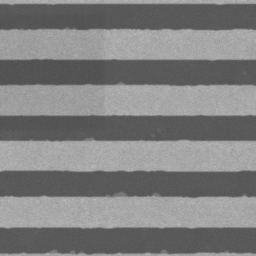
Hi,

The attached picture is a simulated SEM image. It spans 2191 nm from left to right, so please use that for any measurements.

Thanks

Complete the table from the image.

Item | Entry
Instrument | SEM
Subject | lines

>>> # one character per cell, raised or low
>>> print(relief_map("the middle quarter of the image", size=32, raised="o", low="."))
................................
................................
................................
................................
................................
oooooooooooooooooooooooooooo..o.
oooooooooooooooooooooooooooooooo
oooooooooooooooooooooooooooooooo
oooooooooooooooooooooooooooooooo
oooooooooooooooooooooooooooooooo
oooooooooooooooooooooooooooooooo
oooooooooooooooooooooooooooooooo
oooooooooooooooooooooooooooooooo
................................
................................
................................
................................
................................
................................
oooooooooooooooooooooooooooooooo
oooooooooooooooooooooooooooooooo
oooooooooooooooooooooooooooooooo
oooooooooooooooooooooooooooooooo
oooooooooooooooooooooooooooooooo
oooooooooooooooooooooooooooooooo
oooooooooooooooooooooooooooooooo
.ooooooo..ooo..ooo..ooo..ooooooo
................................
................................
................................
................................
................................